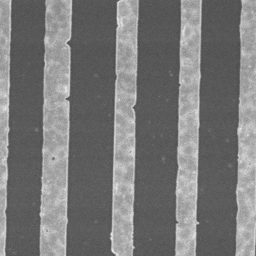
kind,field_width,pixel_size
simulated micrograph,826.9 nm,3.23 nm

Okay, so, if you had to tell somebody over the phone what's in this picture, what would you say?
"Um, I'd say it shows one or a few lines or trenches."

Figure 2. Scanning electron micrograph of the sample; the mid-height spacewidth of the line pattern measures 0.136 micrometres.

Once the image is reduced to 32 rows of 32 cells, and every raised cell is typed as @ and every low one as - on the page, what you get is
@-----@@@------@@------@@-----@@
@-----@@@------@@------@@-----@@
@-----@@@------@@------@@-----@@
@-----@@@------@@------@@-----@@
@-----@@@------@@------@@-----@@
@-----@@-------@@------@@-----@@
@-----@@@------@@------@@-----@@
@-----@@@------@@------@@-----@@
@-----@@@------@@------@@-----@@
@-----@@@------@@------@@-----@@
@-----@@@------@@------@@-----@@
@----@@@-------@@-----@@@-----@@
@-----@@------@@@-----@@@-----@@
@-----@@-------@@-----@@@-----@@
@-----@@@-----@@@------@@-----@@
@----@@@@-----@@@-----@@@-----@@
@----@@@@-----@@@-----@@@-----@@
@----@@@@-----@@@-----@@@-----@@
@----@@@@-----@@@-----@@@-----@@
@----@-@------@@@-----@@@-----@@
@----@@@------@@@-----@@@-----@-
@----@@@------@@@-----@@@-----@@
@----@@@------@@@-----@@@-----@@
@----@@@------@@------@@@-----@@
@----@@@------@@@-----@@@-----@@
@----@@@------@@@-----@@@-----@@
@----@@@------@@@-----@@------@@
@----@@@------@@------@@@-----@@
@-----@@------@@@-----@@------@@
@----@@@------@@@-----@@------@@
@----@@@------@@@-----@-------@@
@----@@@------@@@------@------@@